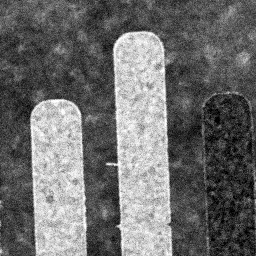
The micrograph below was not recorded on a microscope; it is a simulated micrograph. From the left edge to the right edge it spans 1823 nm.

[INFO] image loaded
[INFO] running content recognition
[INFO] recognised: one or a few lines or trenches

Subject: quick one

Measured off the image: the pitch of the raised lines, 611 nm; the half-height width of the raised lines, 353 nm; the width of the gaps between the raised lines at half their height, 257 nanometres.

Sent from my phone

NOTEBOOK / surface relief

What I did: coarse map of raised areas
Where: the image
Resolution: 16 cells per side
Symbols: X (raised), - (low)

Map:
----------------
----------------
-------XXX------
-------XXX------
-------XXX------
-------XXX------
---X---XXX---XXX
--XXX--XXX---XXX
--XXX--XXX---XXX
--XXX--XXX---XXX
--XXX--XXX---XXX
--XXX--XXXX--XXX
--XXX---XXX--XXX
--XXX---XXX--XXX
--XXX---XXX--XXX
--XXX---XXX--XXX